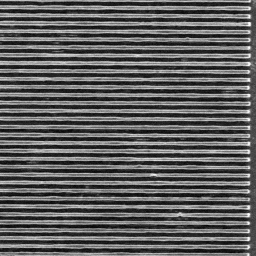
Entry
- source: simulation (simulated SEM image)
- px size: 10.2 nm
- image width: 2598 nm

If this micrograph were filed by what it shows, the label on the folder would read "parallel lines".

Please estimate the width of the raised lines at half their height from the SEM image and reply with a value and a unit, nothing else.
0.0292 micrometres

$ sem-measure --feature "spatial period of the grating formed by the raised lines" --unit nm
80.7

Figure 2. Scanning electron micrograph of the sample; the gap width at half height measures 48.2 nanometres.